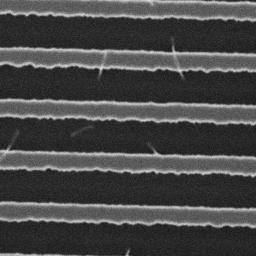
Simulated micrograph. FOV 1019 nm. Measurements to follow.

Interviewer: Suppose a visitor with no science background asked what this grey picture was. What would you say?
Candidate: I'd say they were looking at lines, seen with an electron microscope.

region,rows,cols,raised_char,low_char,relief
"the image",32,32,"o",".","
oooooooooooooooooooooooooooooooo
oooooooooooooooooooooooooooooooo
..............................oo
................................
................................
................................
oooooooooooooooooooooooo........
oooooooooooooooooooooooooooooooo
......o...oooooooooooooooooooooo
................................
................................
................................
ooo.ooo.........................
oooooooooooooooooooooooooooooooo
oooooooooooooooooooooooooooooooo
...............................o
................................
................................
................................
ooooooooooooooooooooooo.oo......
oooooooooooooooooooooooooooooooo
..............o.oooooooooooooooo
................................
................................
................................
oooooooooo......................
oooooooooooooooooooooooooooooooo
oooooooooooooooooooooooooooooooo
................................
................................
................................
................................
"